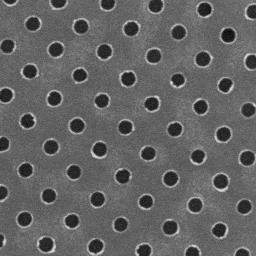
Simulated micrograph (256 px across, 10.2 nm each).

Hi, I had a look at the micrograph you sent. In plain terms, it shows a regular array of holes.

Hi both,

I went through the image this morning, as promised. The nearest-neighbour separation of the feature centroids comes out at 0.345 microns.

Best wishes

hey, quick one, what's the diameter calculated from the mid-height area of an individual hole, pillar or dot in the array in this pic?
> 150 nm